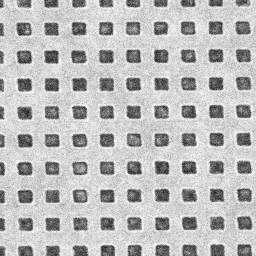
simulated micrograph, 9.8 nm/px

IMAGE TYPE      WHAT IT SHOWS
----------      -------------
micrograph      a regular array of holes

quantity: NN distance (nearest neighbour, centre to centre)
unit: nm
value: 267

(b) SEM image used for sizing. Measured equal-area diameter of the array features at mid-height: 0.16 micrometres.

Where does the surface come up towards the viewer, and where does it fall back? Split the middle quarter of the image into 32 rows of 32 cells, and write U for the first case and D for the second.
UUUUUUUUUUUUUUUUUUUUUUUUUUUUUUUU
UUUUUUUUUUUUUUUUUUUUUUUUUUUUUUUU
UUUUUUUUUUUUUUUUUUUUUUUUUUUUUUUU
UUDDDUUUUDDDUUUUDDDUUUDDDDUUUDDD
UUDDDDUUUDDDDUUDDDDUUUDDDDUUUDDD
UUDDDDUUUDDDDUUDDDDUUUDDDDUUUDDD
UUDDDDUUUDDDUUUUDDDUUUUDDDUUUUDD
UUUUUUUUUUUUUUUUUUUUUUUUUUUUUUUU
UUUUUUUUUUUUUUUUUUUUUUUUUUUUUUUU
UUUUUUUUUUUUUUUUUUUUUUUUUUUUUUUU
UUDDDUUUUDDDUUUUDDDUUUUDDDUUUDDD
UUDDDDUUUDDDDUUDDDDUUUDDDDUUUDDD
UUDDDDUUUDDDDUUDDDDUUUDDDDUUUDDD
UUDDDDUUUDDDUUUUDDDUUUUDDDUUUUDD
UUUUUUUUUUUUUUUUUUUUUUUUUUUUUUUU
UUUUUUUUUUUUUUUUUUUUUUUUUUUUUUUU
UUUUUUUUUUUUUUUUUUUUUUUUUUUUUUUU
UUUDDDUUUDDDUUUUDDDUUUUDDDUUUDDD
UUDDDDUUUDDDDUUDDDDUUUDDDDUUUDDD
UUDDDDUUUDDDDUUDDDDUUUDDDDUUUDDD
UUUDDDUUUDDDDUUUDDDUUUUDDDUUUUDD
UUUUUUUUUUUUUUUUUUUUUUUUUUUUUUUU
UUUUUUUUUUUUUUUUUUUUUUUUUUUUUUUU
UUUUUUUUUUUUUUUUUUUUUUUUUUUUUUUU
UUDDDDUUUDDDUUUUDDDUUUDDDDUUUDDD
UUDDDDUUUDDDDUUUDDDUUUDDDDUUUDDD
UUDDDDUUUDDDDUUUDDDDUUDDDDUUUDDD
UUDDDDUUUDDDDUUUDDDDUUUDDDUUUUDD
UUUUUUUUUUUUUUUUUUUUUUUUUUUUUUUU
UUUUUUUUUUUUUUUUUUUUUUUUUUUUUUUU
UUUUUUUUUUUUUUUUUUUUUUUUUUUUUUUU
UUDDDDUUUDDDDUUUDDDUUUUDDDUUUUDD